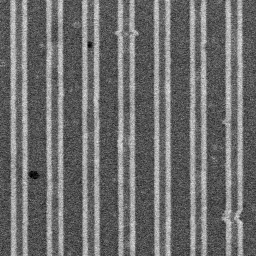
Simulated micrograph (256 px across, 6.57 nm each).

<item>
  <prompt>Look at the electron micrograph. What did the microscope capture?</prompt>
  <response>parallel lines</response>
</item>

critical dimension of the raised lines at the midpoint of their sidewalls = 78 nm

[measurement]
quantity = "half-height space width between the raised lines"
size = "155 nm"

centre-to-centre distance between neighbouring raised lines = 235 nanometers